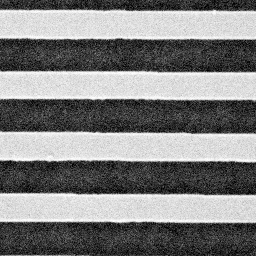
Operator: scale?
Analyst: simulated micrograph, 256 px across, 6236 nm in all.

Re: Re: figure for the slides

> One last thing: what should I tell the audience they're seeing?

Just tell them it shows lines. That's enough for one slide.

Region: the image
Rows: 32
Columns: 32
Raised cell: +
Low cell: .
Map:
................................
+++++++++++++++++++++++++++++...
++++++++++++++++++++++++++++++++
++++++++++++++++++++++++++++++++
++++++++++++++++++++++++++++++++
................................
................................
................................
................................
++++++++++++++++++++++++++++++++
++++++++++++++++++++++++++++++++
++++++++++++++++++++++++++++++++
................................
................................
................................
................................
................................
++++++++++++++++++++++++++++++++
++++++++++++++++++++++++++++++++
++++++++++++++++++++++++++++++++
................................
................................
................................
................................
++++++++++++++++++++............
++++++++++++++++++++++++++++++++
++++++++++++++++++++++++++++++++
++++++++++++++++++++++++++++++++
................................
................................
................................
................................